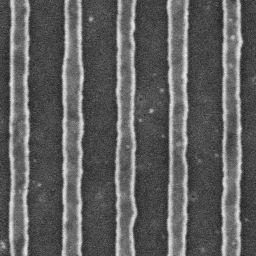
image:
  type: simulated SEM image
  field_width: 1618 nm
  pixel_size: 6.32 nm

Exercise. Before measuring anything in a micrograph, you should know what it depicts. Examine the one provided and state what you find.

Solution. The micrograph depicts lines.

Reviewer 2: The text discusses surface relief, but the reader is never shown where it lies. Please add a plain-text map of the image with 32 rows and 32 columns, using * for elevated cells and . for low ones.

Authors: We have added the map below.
.***....**.....**....**.....**..
..**....**.....**....**.....**..
..*.....**.....**....**.....**..
..*.....**.....**....**.....**..
.**.....**.....**....**.....**..
.**.....**.....**....**.....**..
.**.....**.....**....**.....**..
.**.....**.....**....**.....**..
.**.....**.....**....**.....**..
.**.....**.....**....**.....**..
.**.....**.....**....**.....**..
.**.....**.....**....**.....**..
.**.....**.....**....**.....**..
.**.....**.....**....**.....**..
.**.....**.....**....**.....**..
.***....**.....**....**.....**..
.***....**.....**....**.....**..
.**.....**.....**....**.....**..
.**.....**.....**....**.....**..
.**.....**.....**....**.....**..
.***....**.....**....**.....**..
.***....**.....**....**.....**..
..*.....**.....**....**.....**..
..*.....**.....**....**.....**..
.**.....**.....**....**.....**..
.**.....**.....**....**.....**..
.**.....**.....**....**.....**..
.**.....**.....**....**.....**..
.**.....**.....**....**.....**..
.**.....**.....**....**.....**..
.**.....**.....**....**.....**..
.**.....**.....**....**.....**..